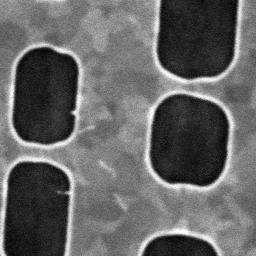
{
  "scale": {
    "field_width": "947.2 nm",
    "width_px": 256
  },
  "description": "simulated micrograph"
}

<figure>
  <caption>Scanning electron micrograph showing one or a few lines or trenches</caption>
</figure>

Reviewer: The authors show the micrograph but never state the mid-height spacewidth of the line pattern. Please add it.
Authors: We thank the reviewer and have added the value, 246 nm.